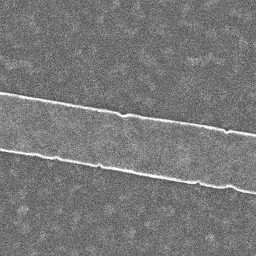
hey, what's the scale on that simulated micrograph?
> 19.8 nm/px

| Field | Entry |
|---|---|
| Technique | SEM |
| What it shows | one or a few lines or trenches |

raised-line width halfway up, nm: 1120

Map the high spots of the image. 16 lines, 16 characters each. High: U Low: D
DDDDDDDDDDDDDDDD
DDDDDDDDDDDDDDDD
DDDDDDDDDDDDDDDD
DDDDDDDDDDDDDDDD
DDDDDDDDDDDDDDDD
DDDDDDDDDDDDDDDD
UUUUDDDDDDDDDDDD
UUUUUUUUUUDDDDDD
UUUUUUUUUUUUUUUU
DUUUUUUUUUUUUUUU
DDDDDDDUUUUUUUUU
DDDDDDDDDDDDDUUU
DDDDDDDDDDDDDDDD
DDDDDDDDDDDDDDDD
DDDDDDDDDDDDDDDD
DDDDDDDDDDDDDDDD